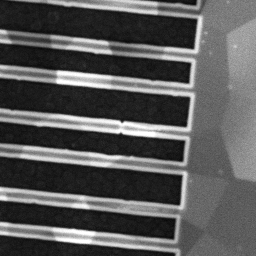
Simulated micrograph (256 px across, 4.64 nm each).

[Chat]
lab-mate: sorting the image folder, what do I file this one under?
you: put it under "parallel lines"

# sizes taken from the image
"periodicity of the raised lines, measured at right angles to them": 179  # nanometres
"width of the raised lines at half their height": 47.3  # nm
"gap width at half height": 117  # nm